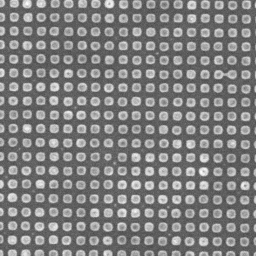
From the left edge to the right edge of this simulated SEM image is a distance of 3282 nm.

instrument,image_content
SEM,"a regular array of raised bodies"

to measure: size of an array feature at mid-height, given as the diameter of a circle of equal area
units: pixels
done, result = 9.02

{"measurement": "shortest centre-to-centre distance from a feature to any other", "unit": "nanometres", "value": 172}